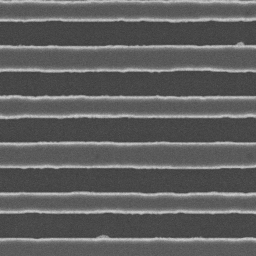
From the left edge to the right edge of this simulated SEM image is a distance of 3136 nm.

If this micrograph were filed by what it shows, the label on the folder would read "lines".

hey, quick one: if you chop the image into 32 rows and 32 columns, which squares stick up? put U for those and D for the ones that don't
UUUUUUUUUUUUUUUUUUUUUUUUUUUUUUUU
UUUUUUUUUUUUUUUUUUUUUUUUUUUUUUUU
UUUUUUUUUUUUUUUUUUUUUUUUUUDUUUUU
DDDDDDDDDDDDDDDDDDDDDDDDDDDDDDDD
DDDDDDDDDDDDDDDDDDDDDDDDDDDDDDDD
DDDDDDDDDDDDDDDDDDDDDDDDDDDDDDDD
UUUUUUUUUUUUUUUUUUUUUUUUUUUUUUUU
UUUUUUUUUUUUUUUUUUUUUUUUUUUUUUUU
UUUUUUUUUUUUUUUUUUUUUUUUUUUUUUUU
DDDDDDDDDDDDDDDDDDDDDDDDDDDDDDDD
DDDDDDDDDDDDDDDDDDDDDDDDDDDDDDDD
DDDDDDDDDDDDDDDDDDDDDDDDDDDDDDDD
UUUUUUUUUUUUUUUUUUUUUUUUUUUUUUUU
UUUUUUUUUUUUUUUUUUUUUUUUUUUUUUUU
UUUUUUUUUUUUUUUUUUUUUUUUUUUUUUUU
DDDDDDDDDDDDDDDDDDDDDDDDDDDDDDDD
DDDDDDDDDDDDDDDDDDDDDDDDDDDDDDDD
DDDDDDDDDDDDDDDDDDDDDDDDDDDDDDDD
UUUUUUUUUUUUUUUUUUUUUUUUUUUUUUUU
UUUUUUUUUUUUUUUUUUUUUUUUUUUUUUUU
UUUUUUUUUUUUUUUUUUUUUUUUUUUUUUUU
DDDDDDDDDDDDDDDDDDDDDDDDDDDDDDDD
DDDDDDDDDDDDDDDDDDDDDDDDDDDDDDDD
DDDDDDDDDDDDDDDDDDDDDDDDDDDDDDDD
UUUUUUUUUUUUUUUUUUUUUUUUUUUUUUUU
UUUUUUUUUUUUUUUUUUUUUUUUUUUUUUUU
UUUUUUUUUUUUUDUUUUUUUUUUUUUUUUUU
DDDDDDDDDDDDDDDDDDDDDDDDDDDDDDDD
DDDDDDDDDDDDDDDDDDDDDDDDDDDDDDDD
DDDDDDDDDDDDDDDDDDDDDDDDDDDDDDDD
UUUUUUUUUUUUUUUUUUUUUUUUUUUUUUUU
UUUUUUUUUUUUUUUUUUUUUUUUUUUUUUUU